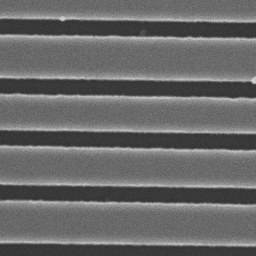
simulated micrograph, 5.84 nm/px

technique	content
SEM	lines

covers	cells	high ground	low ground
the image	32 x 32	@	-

@@@@@@@@@@@@@@@@@@@@@@@@@@@@@@@@
@@@@@@@@@@@@@@@@@@@@@@@@@@@@@@@@
-------@----@@@@@@@@@@@@@@@@@@@@
--------------------------------
@@@@@@@@@@----------------------
@@@@@@@@@@@@@@@@@@@@@@@@@@@@@@@@
@@@@@@@@@@@@@@@@@@@@@@@@@@@@@@@@
@@@@@@@@@@@@@@@@@@@@@@@@@@@@@@@@
@@@@@@@@@@@@@@@@@@@@@@@@@@@@@@@@
@@@@@@@@@@@@@@@@@@@@@@@@@@@@@@@@
--------------------------------
--------------------------------
@@@@@@@@@@@@@@@@@@@@@@@@@@@@@@@@
@@@@@@@@@@@@@@@@@@@@@@@@@@@@@@@@
@@@@@@@@@@@@@@@@@@@@@@@@@@@@@@@@
@@@@@@@@@@@@@@@@@@@@@@@@@@@@@@@@
---------------@@@@@@@@@@@@@@@@@
--------------------------------
@@@@@@@@@@@@@@@@@@-@@-----------
@@@@@@@@@@@@@@@@@@@@@@@@@@@@@@@@
@@@@@@@@@@@@@@@@@@@@@@@@@@@@@@@@
@@@@@@@@@@@@@@@@@@@@@@@@@@@@@@@@
@@@@@@@@@@@@@@@@@@@@@@@@@@@@@@@@
--------------------------------
--------------------------------
@@@@@@@@@@@@@@@@@@@@@@@@@@@@@---
@@@@@@@@@@@@@@@@@@@@@@@@@@@@@@@@
@@@@@@@@@@@@@@@@@@@@@@@@@@@@@@@@
@@@@@@@@@@@@@@@@@@@@@@@@@@@@@@@@
@@@@@@@@@@@@@@@@@@@@@@@@@@@@@@@@
----------@@@@@@@@@@@@@@@@@@@@@@
--------------------------------